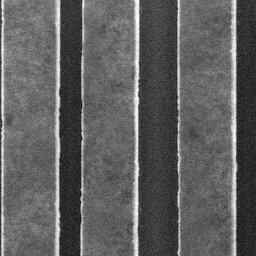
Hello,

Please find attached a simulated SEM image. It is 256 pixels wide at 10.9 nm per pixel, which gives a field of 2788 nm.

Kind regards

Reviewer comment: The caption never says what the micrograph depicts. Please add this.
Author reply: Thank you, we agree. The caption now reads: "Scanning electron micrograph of lines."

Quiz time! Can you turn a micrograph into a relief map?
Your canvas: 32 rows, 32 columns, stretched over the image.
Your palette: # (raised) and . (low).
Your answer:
#######...#######.....#######...
#######...#######.....#######...
#######...#######.....#######...
#######...#######.....#######...
#######...#######.....#######...
#######...#######.....#######...
#######...#######.....#######...
#######...#######.....#######...
#######...#######.....#######...
#######...#######.....#######...
#######...#######.....#######...
#######...#######.....#######...
#######...#######.....#######...
#######...#######.....#######...
#######...#######.....#######...
#######...#######.....#######...
#######...#######.....#######...
#######...#######.....#######...
#######...#######.....#######...
#######...#######.....#######...
#######...#######.....#######...
#######...#######.....#######...
#######...#######.....#######...
#######...#######.....#######...
#######...#######.....#######...
#######...#######.....#######...
#######...#######.....#######...
#######...#######.....#######...
#######...#######.....#######...
#######...#######.....#######...
#######...#######.....#######...
#######...#######.....#######...